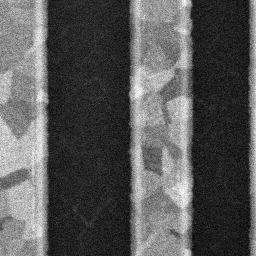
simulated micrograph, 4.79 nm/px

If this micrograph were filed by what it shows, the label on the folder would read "one or a few lines or trenches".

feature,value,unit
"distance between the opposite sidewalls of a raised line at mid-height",0.224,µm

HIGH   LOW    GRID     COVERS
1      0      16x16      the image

1100000001100000
1100000001100000
1100000001100000
1100000001100000
1100000001110000
1100000001110000
1100000001110000
1100000001110000
1100000001100000
1100000001110000
1100000001110000
1100000001110000
1100000001110000
1110000001110000
1110000001100000
1110000001100000